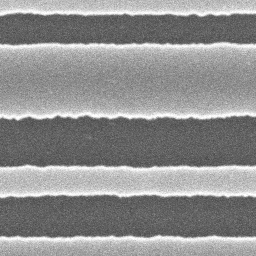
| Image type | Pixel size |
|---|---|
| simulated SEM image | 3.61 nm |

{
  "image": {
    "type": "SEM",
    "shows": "lines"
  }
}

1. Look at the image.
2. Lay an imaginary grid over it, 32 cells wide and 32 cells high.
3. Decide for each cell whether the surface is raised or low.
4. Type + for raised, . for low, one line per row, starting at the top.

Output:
++++++++++++++++++++++++++++++++
++++++++++++++++++++++++++++++++
................................
................................
................................
....++++.+.++...++++....+.++++..
++++++++++++++++++++++++++++++++
++++++++++++++++++++++++++++++++
++++++++++++++++++++++++++++++++
++++++++++++++++++++++++++++++++
++++++++++++++++++++++++++++++++
++++++++++++++++++++++++++++++++
++++++++++++++++++++++++++++++++
++++++++++++++++++++++++++++++++
++++++++++.+++++++++++++++++++.+
................................
................................
................................
................................
................................
................................
++++++++++++++++++++++++++++++++
++++++++++++++++++++++++++++++++
++++++++++++++++++++++++++++++++
+++.+..........+....+.......+++.
................................
................................
................................
................................
...................+......+.....
++++++++++++++++++++++++++++++++
++++++++++++++++++++++++++++++++